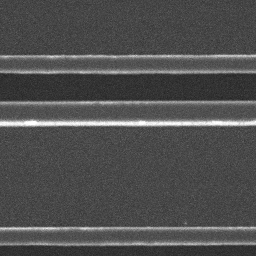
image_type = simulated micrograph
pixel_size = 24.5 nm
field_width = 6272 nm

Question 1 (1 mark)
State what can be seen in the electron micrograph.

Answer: lines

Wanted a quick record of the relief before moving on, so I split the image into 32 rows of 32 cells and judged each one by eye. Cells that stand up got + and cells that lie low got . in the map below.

................................
................................
................................
................................
................................
................................
................................
++++++++++++++++++++++++++++++++
++++++++++++++++++++++++++++++++
................................
................................
................................
................................
++++++++++++++++++++++++++++++++
++++++++++++++++++++++++++++++++
................................
................................
................................
................................
................................
................................
................................
................................
................................
................................
................................
................................
................................
................................
++++++++++++++++++++++++++++++++
++++++++++++++++++++++++++++++..
................................